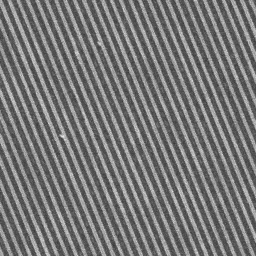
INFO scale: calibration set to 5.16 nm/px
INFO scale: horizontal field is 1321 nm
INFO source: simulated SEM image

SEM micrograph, parallel lines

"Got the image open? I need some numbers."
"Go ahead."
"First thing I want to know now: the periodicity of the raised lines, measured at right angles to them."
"44.4 nm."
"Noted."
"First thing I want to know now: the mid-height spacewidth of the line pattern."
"29.8 nm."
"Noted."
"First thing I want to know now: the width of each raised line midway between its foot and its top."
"14.9 nm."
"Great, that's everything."